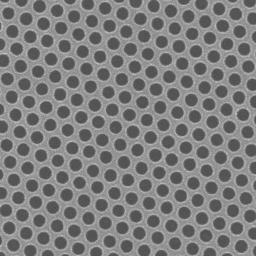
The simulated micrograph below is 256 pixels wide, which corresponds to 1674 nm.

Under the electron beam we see a regular array of holes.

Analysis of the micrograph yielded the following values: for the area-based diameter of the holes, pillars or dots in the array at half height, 0.0842 um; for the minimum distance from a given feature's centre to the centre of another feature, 0.116 micrometres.